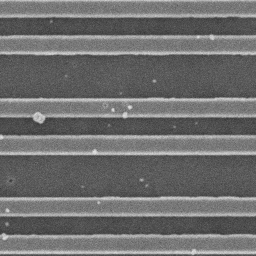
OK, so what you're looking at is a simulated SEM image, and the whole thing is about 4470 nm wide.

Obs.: lines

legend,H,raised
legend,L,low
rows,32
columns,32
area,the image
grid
HHHHHHHHHHHHHHHHHHHHHHHHHHHHHHHH
HHHHHHHHHHHHHHHHHHHHHHHHHHHHHHHH
LLLLLLLLLLLLLLLLLLLLLLLLLLLLLLLL
LLLLLLLLLLLLLLLLLLLLLLLLLLLLLLLL
LLLLLLLLLLLLLHLLHHLLHHHLHLHHLLLL
HHHHHHHHHHHHHHHHHHHHHHHHHHHHHHHH
HHHHHHHHHHHHHHHHHHHHHHHHHHHHHHHH
LLLLLLLLLLLLLLLLLLLLLLLLLLLLLLLL
LLLLLLLLLLLLLLLLLLLLLLLLLLLLLLLL
LLLLLLLLLLLLLLLLLLLLLLLLLLLLLLLL
LLLLLLLLLLLLLLLLLLLLLLLLLLLLLLLL
LLLLLLLLLLLLLLLLLLLLLLLLLLLLLLLL
HHHHHHHHHHHHHHHHHHHHHHHHHHHHHHHH
HHHHHHHHHHHHHHHHHHHHHHHHHHHHHHHH
LLLLHHLLLLLLLHLHLLHLLLLLLLLLLLLL
LLLLLLLLLLLLLLLLLLLLLLLLLLLLLLLL
LLLLLLLLLLLLLLLLLLLLLLLLLLLLLLLL
HHHHHHHHHHHHHHHHHHHHHHHHHHHHHHHH
HHHHHHHHHHHHHHHHHHHHHHHHHHHHHHHH
LLLLLLLLLLLLLLLLLLLLLLLLLLLLLLLL
LLLLLLLLLLLLLLLLLLLLLLLLLLLLLLLL
LLLLLLLLLLLLLLLLLLLLLLLLLLLLLLLL
LLLLLLLLLLLLLLLLLLLLLLLLLLLLLLLL
LLLLLLLLLLLLLLLLLLLLLLLLLLLLLLLL
LLLLLLLLLLLLLLLLLLLLLLLLLLLLLLLL
HHHHHHHHHHHHHHHHHHHHHHHHHHHHHHHH
HHHHHHHHHHHHHHHHHHHHHHHHHHHHHHHH
LLLLLLLLLLLLLLLLLLLLLLLLLLLLLLLL
LLLLLLLLLLLLLLLLLLLLLLLLLLLLLLLL
HHHHHHHHHHHHHHHHHHHHHHHHHHHHHHHH
HHHHHHHHHHHHHHHHHHHHHHHHHHHHHHHH
HHHHHHHHHHHHHHHHHHHHHHHHHHHHHHHH